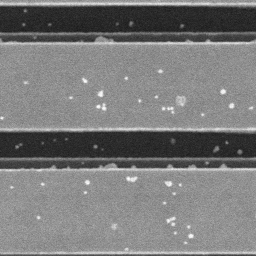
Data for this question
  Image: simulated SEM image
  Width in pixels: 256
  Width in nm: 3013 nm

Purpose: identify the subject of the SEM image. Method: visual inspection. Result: lines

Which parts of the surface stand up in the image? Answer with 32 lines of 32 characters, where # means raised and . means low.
################################
................................
................................
................................
................................
################################
################################
################################
################################
################################
################################
################################
################################
################################
################################
################################
................................
................................
................................
................................
................................
################################
################################
################################
################################
################################
################################
################################
################################
################################
################################
################################